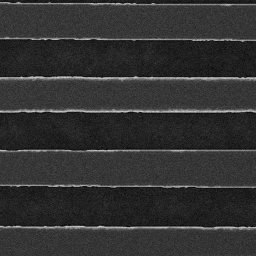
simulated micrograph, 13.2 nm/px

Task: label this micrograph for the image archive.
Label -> lines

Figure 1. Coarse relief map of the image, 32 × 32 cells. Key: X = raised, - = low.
XXXXXXXXXXXXXXXXX--X------------
XXXXXXXXXXXXXXXXXXXXXXXXXXXXXXXX
XXXXXXXXXXXXXXXXXXXXXXXXXXXXXXXX
XXXXXXXXXXXXXXXXXXXXXXXXXXXXXXXX
XXXXXXXXXXXXXXXXXXXXXXXXXXXXXXXX
--------------------------------
--------------------------------
--------------------------------
--------------------------------
--------------------------------
XXXXXXXXXXXXXXXXXXXXXXXXXXXXXXXX
XXXXXXXXXXXXXXXXXXXXXXXXXXXXXXXX
XXXXXXXXXXXXXXXXXXXXXXXXXXXXXXXX
XXXXXXXXXXXXXXXXXXXXXXXXXXXXXXXX
--------------------------------
--------------------------------
--------------------------------
--------------------------------
--------------------------------
XXXXXXXXXXXXXXXXXXXXXXXXXXXXXXXX
XXXXXXXXXXXXXXXXXXXXXXXXXXXXXXXX
XXXXXXXXXXXXXXXXXXXXXXXXXXXXXXXX
XXXXXXXXXXXXXXXXXXXXXXXXXXXXXXXX
--------------------------------
--------------------------------
--------------------------------
--------------------------------
--------------------------------
XXXXXXXXXXXXXXXXXXXXXXXXXX-XX-XX
XXXXXXXXXXXXXXXXXXXXXXXXXXXXXXXX
XXXXXXXXXXXXXXXXXXXXXXXXXXXXXXXX
XXXXXXXXXXXXXXXXXXXXXXXXXXXXXXXX